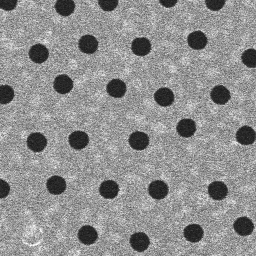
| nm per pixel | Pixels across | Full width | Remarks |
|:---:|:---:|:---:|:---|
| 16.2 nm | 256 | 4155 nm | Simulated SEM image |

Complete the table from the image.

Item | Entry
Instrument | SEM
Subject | a regular array of holes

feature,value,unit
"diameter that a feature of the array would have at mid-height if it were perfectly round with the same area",0.331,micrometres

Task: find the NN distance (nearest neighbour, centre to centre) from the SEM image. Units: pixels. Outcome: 47.1